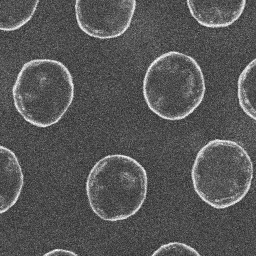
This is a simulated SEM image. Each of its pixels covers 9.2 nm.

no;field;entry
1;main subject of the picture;raised bodies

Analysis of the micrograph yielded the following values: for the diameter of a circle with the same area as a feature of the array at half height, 574 nm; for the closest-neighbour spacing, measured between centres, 0.951 microns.